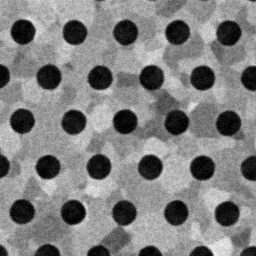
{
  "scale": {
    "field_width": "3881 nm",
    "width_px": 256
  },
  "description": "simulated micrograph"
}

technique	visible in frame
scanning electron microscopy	a regular array of holes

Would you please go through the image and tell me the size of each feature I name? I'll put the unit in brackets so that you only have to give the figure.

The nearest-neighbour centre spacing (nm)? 773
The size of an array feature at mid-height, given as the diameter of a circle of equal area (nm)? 399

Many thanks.